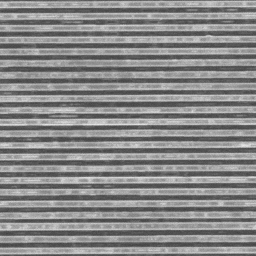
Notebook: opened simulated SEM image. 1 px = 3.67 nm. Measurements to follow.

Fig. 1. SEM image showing parallel lines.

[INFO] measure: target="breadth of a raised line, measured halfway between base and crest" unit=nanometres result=21.6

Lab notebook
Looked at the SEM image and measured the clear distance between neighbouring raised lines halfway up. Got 22 nm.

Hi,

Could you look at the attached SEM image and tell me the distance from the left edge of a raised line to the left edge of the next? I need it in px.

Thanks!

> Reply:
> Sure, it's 11.7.